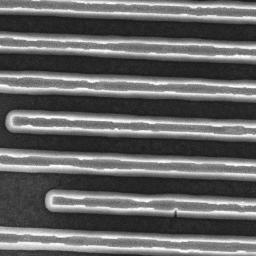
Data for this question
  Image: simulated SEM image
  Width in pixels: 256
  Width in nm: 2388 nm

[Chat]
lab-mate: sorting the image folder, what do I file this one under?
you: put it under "parallel lines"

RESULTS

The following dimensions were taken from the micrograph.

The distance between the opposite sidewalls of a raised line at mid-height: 0.162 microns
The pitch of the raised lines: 365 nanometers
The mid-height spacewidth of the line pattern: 203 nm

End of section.